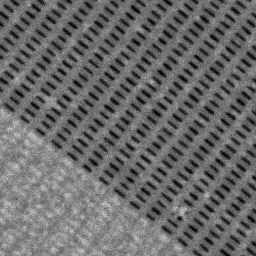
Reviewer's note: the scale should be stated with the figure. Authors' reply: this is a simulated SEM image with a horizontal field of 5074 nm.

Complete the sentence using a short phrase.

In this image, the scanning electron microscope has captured a regular array of holes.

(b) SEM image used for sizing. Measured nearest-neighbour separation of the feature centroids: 167 nm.